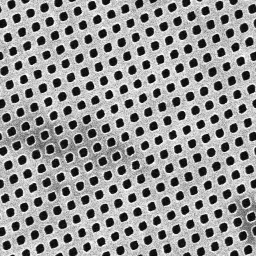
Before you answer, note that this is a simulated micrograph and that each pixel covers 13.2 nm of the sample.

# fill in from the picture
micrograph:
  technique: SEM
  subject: a regular array of holes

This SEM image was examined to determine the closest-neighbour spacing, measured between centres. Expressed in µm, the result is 0.195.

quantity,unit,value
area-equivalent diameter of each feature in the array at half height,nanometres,122